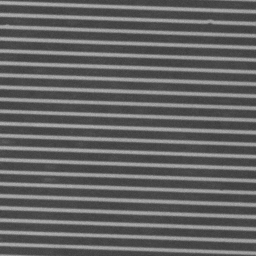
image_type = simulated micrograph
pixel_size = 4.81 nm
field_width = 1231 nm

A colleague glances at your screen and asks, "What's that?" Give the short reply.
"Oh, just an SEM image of parallel lines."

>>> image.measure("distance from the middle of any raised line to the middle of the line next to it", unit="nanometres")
58.1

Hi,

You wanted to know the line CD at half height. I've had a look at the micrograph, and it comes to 16.2 nm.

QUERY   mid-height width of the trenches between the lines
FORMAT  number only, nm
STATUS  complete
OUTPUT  41.5